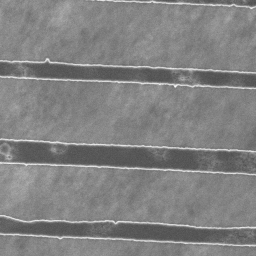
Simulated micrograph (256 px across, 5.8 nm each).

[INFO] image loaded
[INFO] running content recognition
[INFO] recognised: one or a few lines or trenches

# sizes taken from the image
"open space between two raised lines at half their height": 361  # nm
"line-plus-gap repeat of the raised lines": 455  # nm